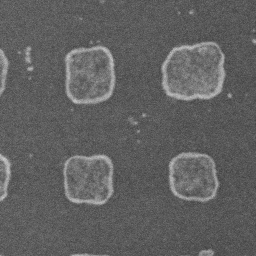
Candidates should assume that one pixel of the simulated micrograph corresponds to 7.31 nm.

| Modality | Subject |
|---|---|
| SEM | raised bodies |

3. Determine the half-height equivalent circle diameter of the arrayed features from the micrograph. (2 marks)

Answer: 376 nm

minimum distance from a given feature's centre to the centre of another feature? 765 nm